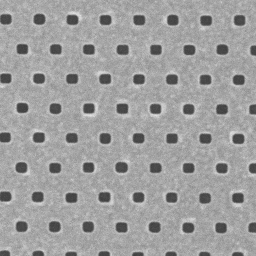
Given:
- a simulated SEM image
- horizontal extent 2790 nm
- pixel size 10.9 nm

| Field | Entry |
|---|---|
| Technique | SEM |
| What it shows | a regular array of holes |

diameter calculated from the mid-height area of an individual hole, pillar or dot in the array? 136 nm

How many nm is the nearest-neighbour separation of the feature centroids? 360